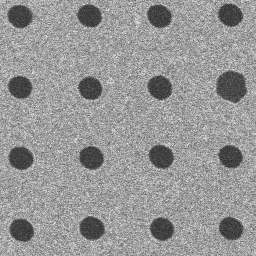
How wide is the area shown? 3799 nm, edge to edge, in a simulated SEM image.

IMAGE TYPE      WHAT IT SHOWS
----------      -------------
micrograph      a regular array of holes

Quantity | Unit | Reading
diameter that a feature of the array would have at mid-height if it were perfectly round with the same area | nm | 356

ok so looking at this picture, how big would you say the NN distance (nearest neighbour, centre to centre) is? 69.7 pixels